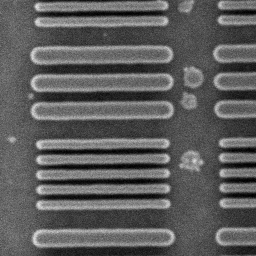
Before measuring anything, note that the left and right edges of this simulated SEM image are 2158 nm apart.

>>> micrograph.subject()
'groups of lines, slits or small figures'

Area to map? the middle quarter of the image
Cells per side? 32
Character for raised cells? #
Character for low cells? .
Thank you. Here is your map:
................................
................................
................................
###########################.....
###########################.....
###########################.....
#########################.......
................................
................................
...............##....#####......
###########################.....
###########################.....
###########################.....
#################..###..........
................................
................................
................................
................................
................................
##########################......
##########################......
................................
................................
##########################......
##########################......
................................
.....................#####......
##########################......
##################..............
................................
#.....####################......
##########################......